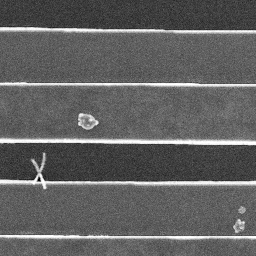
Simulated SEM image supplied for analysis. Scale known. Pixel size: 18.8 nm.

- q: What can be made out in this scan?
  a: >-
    lines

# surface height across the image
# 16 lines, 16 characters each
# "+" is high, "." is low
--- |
................
................
++++++++++++++++
++++++++++++++++
++++++++++++++++
++++++++++++++++
++++++++++++++++
++++++++++++++++
++++++++++++++++
................
................
++++++++++++.+.+
++++++++++++++++
++++++++++++++++
++++++++++++++++
++++++++++++++++